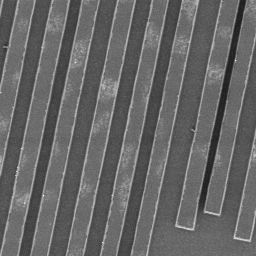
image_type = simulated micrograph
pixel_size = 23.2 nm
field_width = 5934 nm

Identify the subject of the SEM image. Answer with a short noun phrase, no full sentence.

parallel lines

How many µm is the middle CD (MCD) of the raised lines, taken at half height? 0.383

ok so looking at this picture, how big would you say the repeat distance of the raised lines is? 744 nm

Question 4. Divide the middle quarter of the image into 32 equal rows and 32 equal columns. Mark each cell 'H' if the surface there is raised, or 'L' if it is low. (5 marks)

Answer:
LHHHHLLLLLHHHHLLLLLHHHHLLLHHHHLL
LHHHHLLLLLHHHHLLLLLHHHHLLLHHHHLL
LHHHHLLLLLHHHHLLLLHHHHLLLLHHHHLL
LHHHHLLLLHHHHHLLLLHHHHLLLLHHHHLL
LHHHHLLLLHHHHHLLLLHHHHLLLHHHHHLL
HHHHHLLLLHHHHLLLLLHHHHLLLHHHHLLL
HHHHLLLLLHHHHLLLLLHHHHLLLHHHHLLL
HHHHLLLLLHHHHLLLLHHHHLLLLHHHHLLL
HHHHLLLLHHHHHLLLLHHHHLLLLHHHHLLL
HHHLLLLLHHHHHLLLLHHHHLLLLHHHHLLL
HHHLLLLLHHHHLLLLLHHHHLLLHHHHLLLL
HHHLLLLLHHHHLLLLHHHHLLLLHHHHLLLL
HHHLLLLLHHHHLLLLHHHHLLLLHHHHLLLL
HHHLLLLLHHHHLLLLHHHHLLLLHHHHLLLL
HHHLLLLHHHHHLLLLHHHHLLLLHHHLLLLL
HHLLLLLHHHHLLLLLHHHHLLLHHHHLLLLL
HHLLLLLHHHHLLLLHHHHHLLLHHHHLLLLL
HHLLLLLHHHHLLLLHHHHLLLLHHHHLLLLL
HHLLLLHHHHHLLLLHHHHLLLLHHHHLLLLL
HHLLLLHHHHHLLLLHHHHLLLLHHHLLLLLL
HLLLLLHHHHLLLLLHHHHLLLHHHHLLLLLL
HLLLLLHHHHLLLLHHHHHLLLHHHHLLLLLL
HLLLLLHHHHLLLLHHHHLLLLHHHHLLLLLL
HLLLLHHHHHLLLLHHHHLLLLHHHHLLLLLH
HLLLLHHHHHLLLLHHHHLLLLHHHLLLLLLH
LLLLLHHHHLLLLLHHHHLLLHHHHLLLLLLH
LLLLLHHHHLLLLHHHHHLLLHHHHLLLLLLH
LLLLLHHHHLLLLHHHHLLLLHHHHLLLLLLH
LLLLHHHHHLLLLHHHHLLLLHHHHLLLLLHH
LLLLHHHHHLLLLHHHHLLLLHHHLLLLLLHH
LLLLHHHHLLLLLHHHHLLLHHHHLLLLLLHH
LLLLHHHHLLLLHHHHHLLLHHHHLLLLLLHH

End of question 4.